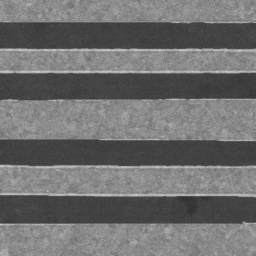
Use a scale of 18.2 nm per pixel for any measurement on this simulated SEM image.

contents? lines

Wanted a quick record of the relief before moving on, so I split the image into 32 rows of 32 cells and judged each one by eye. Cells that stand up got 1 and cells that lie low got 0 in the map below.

11111111111111111111111111111111
11111111111111111111111111111111
11111111111111111111111111111111
00000000000000000000000000000000
00000000000000000000000000000000
00000000000000000000000000000000
11111111111111111111111111111111
11111111111111111111111111111111
11111111111111111111111111111111
00000000000000000000000000000000
00000000000000000000000000000000
00000000000000000000000000000000
00000000000000000000011111111111
11111111111111111111111111111111
11111111111111111111111111111111
11111111111111111111111111111111
11111111111111111111111111111111
00000000000000000000000000011111
00000000000000000000000000000000
00000000000000000000000000000000
00000000000000000000000000000000
11111111111111111111111111111111
11111111111111111111111111111111
11111111111111111111111111111111
00000000000000000000000000000000
00000000000000000000000000000000
00000000000000000000000000000000
00000000000000000000000000000000
11111111111111111111111111111111
11111111111111111111111111111111
11111111111111111111111111111111
11111111111111111111111111111111